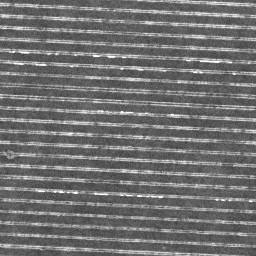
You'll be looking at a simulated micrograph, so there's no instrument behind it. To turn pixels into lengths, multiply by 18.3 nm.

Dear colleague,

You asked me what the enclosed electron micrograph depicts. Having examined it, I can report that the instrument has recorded parallel lines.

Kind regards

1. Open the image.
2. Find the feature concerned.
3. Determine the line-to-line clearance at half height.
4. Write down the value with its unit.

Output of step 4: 0.16 µm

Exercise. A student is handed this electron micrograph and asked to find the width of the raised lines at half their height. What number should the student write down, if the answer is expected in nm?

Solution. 48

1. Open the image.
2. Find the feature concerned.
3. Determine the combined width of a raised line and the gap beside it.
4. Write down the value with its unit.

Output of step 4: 210 nanometers